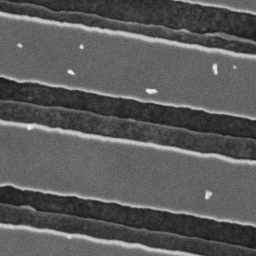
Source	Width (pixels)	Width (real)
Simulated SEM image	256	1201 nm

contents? lines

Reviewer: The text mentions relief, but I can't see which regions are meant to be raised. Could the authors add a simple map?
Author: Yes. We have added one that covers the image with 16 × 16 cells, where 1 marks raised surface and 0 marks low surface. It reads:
0000000000000011
1111100000000000
1111111111100000
1111111111111111
1111111111111111
0000111111111111
0000000000111111
0000000000000000
1111110000000000
1111111111110000
1111111111111111
1111111111111111
0000001111111111
0000000000001111
1111000000000000
1111111111000000